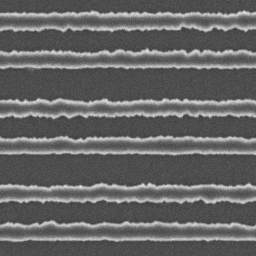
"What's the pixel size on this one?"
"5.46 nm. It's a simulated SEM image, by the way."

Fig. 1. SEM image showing lines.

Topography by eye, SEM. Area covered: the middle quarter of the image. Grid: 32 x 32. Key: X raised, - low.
XXXXXXXXXXXXXXXXXXXXXXXXXXXXXXXX
--------------------------------
--------------------------------
--------------------------------
--------------------------------
--------------------------------
--------------------------------
--------------------------------
--------------------------------
XXXXX-XXXXXX-X-XXXXXXXXXXXXXXXXX
XXXXXXXXXXXXXXXXXXXXXXXXXXXXXXXX
XXXXXXXXXXXXXXXXXXXXXXXXXXXXXXXX
XXXXXXXXXXXXXXXXXXXXXXXXXXXXXX-X
--------------------------------
--------------------------------
--------------------------------
--------------------------------
--------------------------------
X-----XX-XXXXXXXX----X-XXXXXXXXX
XXXXXXXXXXXXXXXXXXXXXXXXXXXXXXXX
XXXXXXXXXXXXXXXXXXXXXXXXXXXXXXXX
XXXXXXXXXXXXXXXXXXXXXXXXXXXXXXXX
---------------------------X----
--------------------------------
--------------------------------
--------------------------------
--------------------------------
--------------------------------
--------------------------------
--------------------------------
X------XXXX-X------XXXX-XXXX-X--
XXXXXXXXXXXXXXXXXXXXXXXXXXXXXXXX